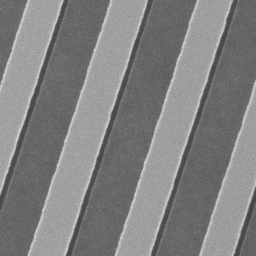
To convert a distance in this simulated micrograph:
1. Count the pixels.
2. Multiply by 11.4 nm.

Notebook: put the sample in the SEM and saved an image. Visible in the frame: lines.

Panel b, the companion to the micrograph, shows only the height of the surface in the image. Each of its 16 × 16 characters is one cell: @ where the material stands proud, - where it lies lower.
--@@---@@---@@--
-@@---@@@---@@--
-@@---@@----@@--
-@@---@@---@@---
@@---@@@---@@---
@@---@@----@@---
@@---@@---@@----
@@--@@@---@@---@
@---@@@---@@---@
@---@@---@@----@
@---@@---@@---@@
---@@@---@@---@@
---@@---@@@---@@
---@@---@@---@@-
--@@@---@@---@@-
--@@---@@@---@@-